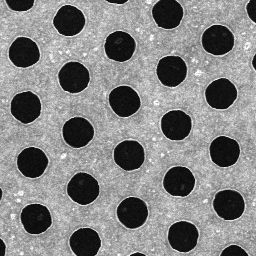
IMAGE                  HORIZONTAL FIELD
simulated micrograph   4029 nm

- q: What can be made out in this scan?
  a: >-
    a regular array of holes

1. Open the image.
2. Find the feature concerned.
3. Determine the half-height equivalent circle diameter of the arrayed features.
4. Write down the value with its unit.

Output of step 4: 490 nanometres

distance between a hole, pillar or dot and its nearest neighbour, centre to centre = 858 nm